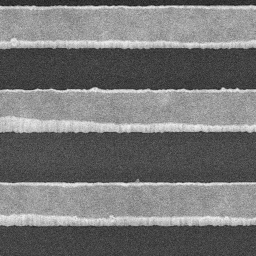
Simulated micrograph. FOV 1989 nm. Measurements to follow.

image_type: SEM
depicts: lines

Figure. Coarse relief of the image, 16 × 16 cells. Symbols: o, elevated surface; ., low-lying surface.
oooooooooooooooo
oooooooooooooooo
oooooooooooooooo
................
................
................
oooooooooooooooo
oooooooooooooooo
................
................
................
oooooooooooooooo
oooooooooooooooo
oooooooooooooooo
................
................